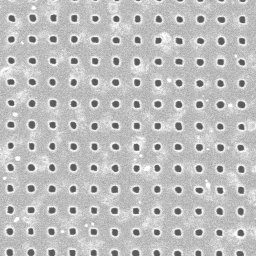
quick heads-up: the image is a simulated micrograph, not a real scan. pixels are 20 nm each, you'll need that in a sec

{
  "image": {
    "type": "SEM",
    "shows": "a regular array of holes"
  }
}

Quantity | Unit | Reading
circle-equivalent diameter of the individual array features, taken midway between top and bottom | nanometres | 145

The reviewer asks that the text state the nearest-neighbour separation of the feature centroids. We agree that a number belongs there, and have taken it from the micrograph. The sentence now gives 416 nm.